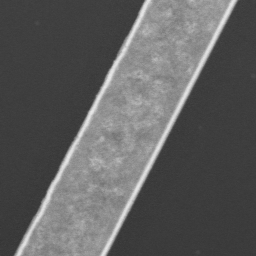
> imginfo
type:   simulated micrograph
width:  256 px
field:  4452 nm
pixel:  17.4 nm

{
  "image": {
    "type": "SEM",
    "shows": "one or a few lines or trenches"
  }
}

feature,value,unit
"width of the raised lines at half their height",75.3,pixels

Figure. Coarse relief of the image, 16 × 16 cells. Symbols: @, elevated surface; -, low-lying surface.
---------@@@@@--
---------@@@@@--
--------@@@@@---
--------@@@@@---
-------@@@@@----
-------@@@@@----
------@@@@@-----
-----@@@@@@-----
-----@@@@@------
----@@@@@@------
----@@@@@-------
---@@@@@@-------
---@@@@@--------
--@@@@@@--------
--@@@@@---------
-@@@@@@---------